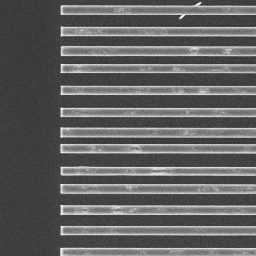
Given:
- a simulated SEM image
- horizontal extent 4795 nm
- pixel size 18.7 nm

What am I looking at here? parallel lines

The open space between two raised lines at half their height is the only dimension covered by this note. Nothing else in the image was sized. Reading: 0.223 microns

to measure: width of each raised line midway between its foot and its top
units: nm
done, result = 171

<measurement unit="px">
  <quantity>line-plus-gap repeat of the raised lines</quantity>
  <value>20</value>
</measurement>